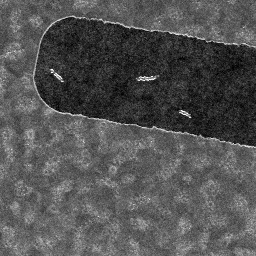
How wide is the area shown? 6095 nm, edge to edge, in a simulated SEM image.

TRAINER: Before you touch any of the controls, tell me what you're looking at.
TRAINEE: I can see one or a few lines or trenches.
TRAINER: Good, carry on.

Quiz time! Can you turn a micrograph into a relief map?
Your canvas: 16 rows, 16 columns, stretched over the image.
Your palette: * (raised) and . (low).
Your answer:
****************
***....*********
***..........***
**..............
**..............
**..............
***.............
*******.........
************....
****************
****************
****************
****************
****************
****************
****************